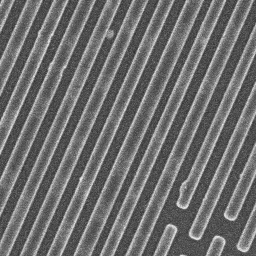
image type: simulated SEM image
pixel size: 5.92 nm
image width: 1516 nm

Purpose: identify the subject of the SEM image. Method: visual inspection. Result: parallel lines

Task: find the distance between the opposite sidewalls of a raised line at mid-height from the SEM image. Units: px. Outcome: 12.7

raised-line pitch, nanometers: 143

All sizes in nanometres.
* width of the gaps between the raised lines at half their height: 63.6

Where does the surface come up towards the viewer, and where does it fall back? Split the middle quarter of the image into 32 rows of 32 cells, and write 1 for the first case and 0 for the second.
10001110001111000111000111110011
00011110001110001111000111100011
00011100011110001110001111100111
00111100011100011110001111000111
00111000111100011100001111001110
01111000111000111100011110001110
01110001111000111000011110011110
01110001111000111000111100011100
11100011110001111000111100111100
11100011110001110001111100111000
11100011100011110001111000111000
11000111100011100011111001110000
11000111000111100011110001110001
10001111000111000011110011100001
10001110001111000111100011100011
00011110001110000111100111100011
00011110001110001111000111000111
00111100011110001111000111000111
00111100011100011111001110001111
00111000111100011110001110001111
01111000111000011110011100001110
01110001111000111100011100011110
11110001110000111100111000011100
11110001110001111000111000111100
11100011100001111001111000111100
11100011100011111001110001111000
11000111100011110001110001111000
11000111000111110011100001110001
10001111000111100011100011110001
10001110000111100111000011100011
00011110001111000111000111100111
00011100001111001110000111000111